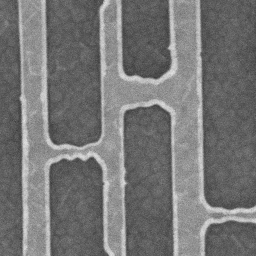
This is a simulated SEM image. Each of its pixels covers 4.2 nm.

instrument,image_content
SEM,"one or a few lines or trenches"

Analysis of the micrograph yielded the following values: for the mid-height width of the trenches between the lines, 212 nm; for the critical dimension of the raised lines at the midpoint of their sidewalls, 106 nanometres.